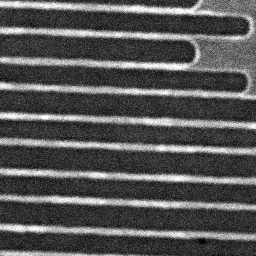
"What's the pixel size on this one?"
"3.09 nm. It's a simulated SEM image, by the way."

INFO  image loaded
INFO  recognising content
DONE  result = parallel lines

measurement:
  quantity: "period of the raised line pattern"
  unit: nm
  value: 86.4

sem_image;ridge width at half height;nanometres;13.5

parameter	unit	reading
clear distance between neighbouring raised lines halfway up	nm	70.3